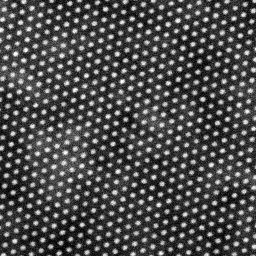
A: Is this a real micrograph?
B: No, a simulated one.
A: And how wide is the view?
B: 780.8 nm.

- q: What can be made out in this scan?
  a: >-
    a regular array of raised bodies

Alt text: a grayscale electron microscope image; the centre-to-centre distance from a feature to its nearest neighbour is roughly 31.3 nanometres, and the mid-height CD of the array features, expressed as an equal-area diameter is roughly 13.8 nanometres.